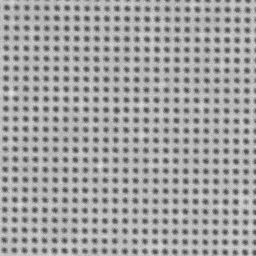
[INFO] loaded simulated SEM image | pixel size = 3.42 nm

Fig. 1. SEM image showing a regular array of holes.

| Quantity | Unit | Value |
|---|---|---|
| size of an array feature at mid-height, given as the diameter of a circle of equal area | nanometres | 21.5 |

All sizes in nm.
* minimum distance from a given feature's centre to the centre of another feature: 33